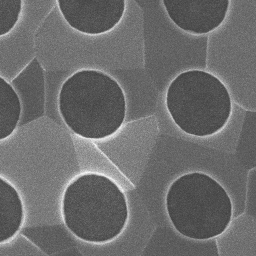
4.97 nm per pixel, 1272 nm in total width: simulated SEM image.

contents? holes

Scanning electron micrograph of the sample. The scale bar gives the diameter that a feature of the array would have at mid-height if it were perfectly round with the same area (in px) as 66.5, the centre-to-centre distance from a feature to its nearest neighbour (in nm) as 515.